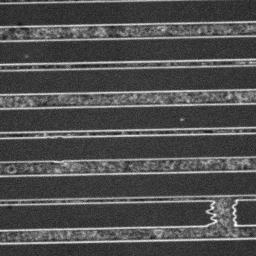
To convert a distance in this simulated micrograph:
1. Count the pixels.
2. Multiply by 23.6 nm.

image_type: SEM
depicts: parallel lines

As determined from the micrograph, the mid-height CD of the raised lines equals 0.571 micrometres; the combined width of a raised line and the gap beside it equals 788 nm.